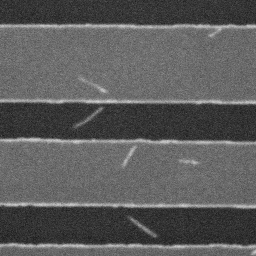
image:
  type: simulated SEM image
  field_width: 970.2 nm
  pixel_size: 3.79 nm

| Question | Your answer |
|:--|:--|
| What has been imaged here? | lines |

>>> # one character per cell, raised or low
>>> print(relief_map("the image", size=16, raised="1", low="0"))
0000000000000000
0000000000000000
1111111111111111
1111111111111111
1111111111111111
1111111111111111
0000000000000000
0000000000000000
0000000000000000
1111111111111111
1111111111111111
1111111111111111
1111111111111111
0000000000000000
0000000000000000
1111111111111111